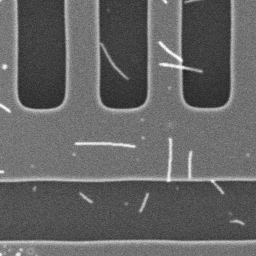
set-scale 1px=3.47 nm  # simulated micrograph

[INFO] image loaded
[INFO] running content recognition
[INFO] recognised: groups of lines, slits or small figures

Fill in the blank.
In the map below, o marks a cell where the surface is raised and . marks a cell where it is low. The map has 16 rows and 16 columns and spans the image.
o...oo...oo...oo
o...oo...oo....o
o...oo...oo...oo
o...oo...oo...oo
o...oo...oo...oo
o...oo...oo...oo
o...ooo..ooo..oo
oooooooooooooooo
oooooooooooooooo
oooooooooooooooo
oooooooooooooooo
................
................
................
................
oooooooooooooooo